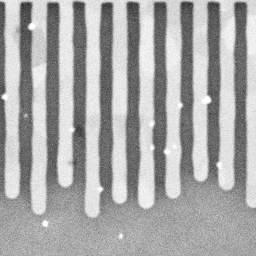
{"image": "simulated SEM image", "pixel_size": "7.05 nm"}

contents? groups of lines, slits or small figures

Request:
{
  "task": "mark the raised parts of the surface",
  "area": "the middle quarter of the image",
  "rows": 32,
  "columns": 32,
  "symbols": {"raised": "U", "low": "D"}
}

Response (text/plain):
UUDDDDUUUDDDUUUUDDDUUUDDDDUUUDDD
UUDDDDUUUDDDUUUDDDDUUUDDDDUUUDDD
UUDDDDUUUDDDUUUDDDDUUUDDDDUUUDDD
UUDDDDUUUDDDUUUDDDDUUUDDDDUUUDDD
UUDDDDUUUDDDUUUUDDDUUUDDDDUUUDDD
UUDDDDUUUDDDUUUUDDDUUUDDDDUUUDDD
UUDDDDUUUDDDUUUUDDDUUUDDDDUUUDDD
UUDDDDUUUDDDUUUUDDDUUUDDDDUUUDDD
UUDDDDUUUDDDUUUUDDDUUUDDDDUUUDDD
UUDDDDUUUDDDUUUDDDDUUUDDDDUUUDDD
UUDDDDUUUDDDUUUUDDDUUUDDDDUUUDDD
UUDDDDUUUDDDUUUUDDDUUUDDDDUUUDDD
UUDDDDUUUDDDUUUDDDDUUUDDDDUUUDDD
UUDDDDUUUDDDUUUDDDDUUUDDDDUUUDDD
UUDDDDUUUDDDUUUDDDDUUUDDDDUUUDDD
UUDDDDUUUDDDUUUDDDDUUUDDDDUUUDDD
UUDDDDUUUDDDUUUDDDDUUUDDDDUUUDDD
UUDDDDUUUDDDUUUDDDDUUUDDDDUUUDDD
UUDDDDUUUDDDUUUDDDDUUUDDDDUUUDDD
UUDDDDUUUDDDDUUDDDDUUUDDDDUUUDDD
UUDDDDUUDDDDUUUDDDDUUUDDDDUUUDDD
UUDDDDUUUDDDUUUDDDDUUUDDDUUUUDDD
UUDDDDUUUDDDUUUDDDDUUUDDDUUUUDDD
UUDDDDUUUDDDUUUDDDDUUUDDDDUUUDDD
UUDDDDUUUDDDUUUDDDDUUUDDDDUUUDDD
UUDDDDUUUDDDUUUDDDDUUUDDDDUUUDDD
UUDDDDUUUDDDUUUDDDDUUUDDDDUUUDDD
UUDDDDUUUDDDUUUDDDDUUUDDDDUUUDDD
UUDDDDUUUDDDUUUDDDDUUUDDDDUUUDDD
UUDDDDUUUDDDUUUDDDDUUUDDDDUUUDDD
UDDDDDUUUDDDUUUDDDDUUUDDDDUUUDDD
DDDDDDUUUDDDUUUDDDDUUUDDDDUUUDDD